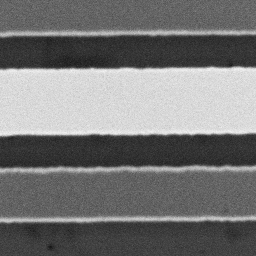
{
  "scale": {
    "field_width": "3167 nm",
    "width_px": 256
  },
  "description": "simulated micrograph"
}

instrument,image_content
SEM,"lines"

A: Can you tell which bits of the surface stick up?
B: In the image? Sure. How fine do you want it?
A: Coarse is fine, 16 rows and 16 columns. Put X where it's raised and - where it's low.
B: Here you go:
XXXXXXXXXXXXXXXX
XXXXXXXXXXXXXXXX
----------------
----------------
XXXXXXXXXXXXXXXX
XXXXXXXXXXXXXXXX
XXXXXXXXXXXXXXXX
XXXXXXXXXXXXXXXX
----------------
----------------
-------XXXXXXXXX
XXXXXXXXXXXXXXXX
XXXXXXXXXXXXXXXX
XXXXXXXXXXXXXXXX
----------------
----------------